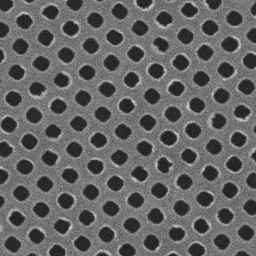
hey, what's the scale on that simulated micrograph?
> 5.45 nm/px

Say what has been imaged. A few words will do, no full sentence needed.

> a regular array of holes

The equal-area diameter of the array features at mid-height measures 83.7 nanometres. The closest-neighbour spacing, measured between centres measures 25.6 px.